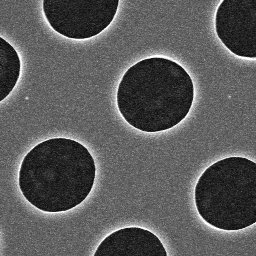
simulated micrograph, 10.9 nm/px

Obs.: holes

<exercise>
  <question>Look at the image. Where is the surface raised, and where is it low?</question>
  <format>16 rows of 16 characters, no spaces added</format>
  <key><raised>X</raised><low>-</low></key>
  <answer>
XXX----XXXXXXX--
XXX----XXXXXX---
XXXXXXXXXXXXXX--
-XXXXXXXXXXXXXX-
-XXXXXXX----XXXX
-XXXXXX-----XXXX
XXXXXXX-----XXXX
XXXXXXXX---XXXXX
XXXXXXXXXXXXXXXX
XX----XXXXXXXXXX
X-----XXXXXXX---
X-----XXXXXX----
XX---XXXXXXX----
XXXXXXXXXXXXX---
XXXXXXX--XXXXXXX
XXXXXX----XXXXXX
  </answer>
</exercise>